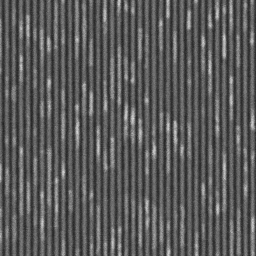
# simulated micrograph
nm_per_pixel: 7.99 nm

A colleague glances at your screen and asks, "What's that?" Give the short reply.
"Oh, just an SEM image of parallel lines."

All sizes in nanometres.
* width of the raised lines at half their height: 27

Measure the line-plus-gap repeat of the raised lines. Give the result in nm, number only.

56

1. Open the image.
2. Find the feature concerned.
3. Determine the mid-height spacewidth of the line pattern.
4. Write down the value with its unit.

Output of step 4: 0.028 micrometres